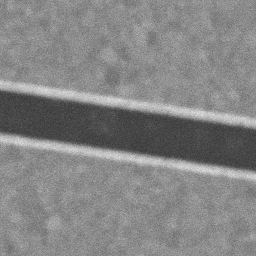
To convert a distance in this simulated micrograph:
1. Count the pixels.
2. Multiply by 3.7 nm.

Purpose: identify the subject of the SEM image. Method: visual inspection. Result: one or a few lines or trenches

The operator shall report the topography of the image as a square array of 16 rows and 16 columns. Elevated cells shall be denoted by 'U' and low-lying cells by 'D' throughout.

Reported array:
UUUUUUUUUUUUUUUU
UUUUUUUUUUUUUUUU
UUUUUUUUUUUUUUUU
UUUUUUUUUUUUUUUU
UUUUUUUUUUUUUUUU
DUUUUUUUUUUUUUUU
DDDDDDDUUUUUUUUU
DDDDDDDDDDDDDDUU
DDDDDDDDDDDDDDDD
UUUUUUDDDDDDDDDD
UUUUUUUUUUUUUDDD
UUUUUUUUUUUUUUUU
UUUUUUUUUUUUUUUU
UUUUUUUUUUUUUUUU
UUUUUUUUUUUUUUUU
UUUUUUUUUUUUUUUU